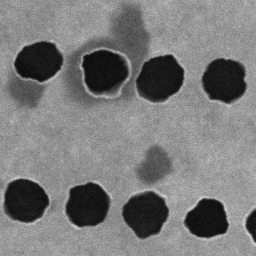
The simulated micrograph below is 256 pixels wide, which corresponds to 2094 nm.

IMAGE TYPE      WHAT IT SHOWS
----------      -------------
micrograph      a regular array of holes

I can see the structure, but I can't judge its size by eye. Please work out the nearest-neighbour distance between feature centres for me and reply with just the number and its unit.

494 nanometres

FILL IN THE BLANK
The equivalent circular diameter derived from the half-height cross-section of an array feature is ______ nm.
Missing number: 361